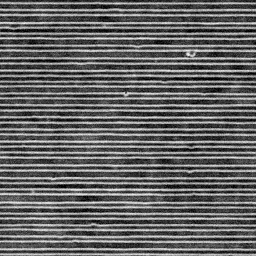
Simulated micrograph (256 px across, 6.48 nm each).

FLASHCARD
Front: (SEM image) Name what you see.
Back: parallel lines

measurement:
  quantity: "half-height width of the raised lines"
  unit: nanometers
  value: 31.6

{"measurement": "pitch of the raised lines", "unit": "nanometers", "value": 77.6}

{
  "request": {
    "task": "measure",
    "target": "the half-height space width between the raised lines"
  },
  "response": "6.74 pixels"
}